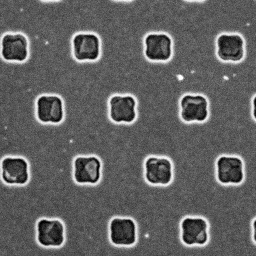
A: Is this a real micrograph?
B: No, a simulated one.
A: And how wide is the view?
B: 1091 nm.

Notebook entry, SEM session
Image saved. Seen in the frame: a regular array of holes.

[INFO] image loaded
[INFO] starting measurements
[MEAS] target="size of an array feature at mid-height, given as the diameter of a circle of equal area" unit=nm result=118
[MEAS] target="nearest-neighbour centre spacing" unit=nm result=302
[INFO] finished